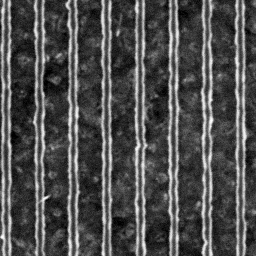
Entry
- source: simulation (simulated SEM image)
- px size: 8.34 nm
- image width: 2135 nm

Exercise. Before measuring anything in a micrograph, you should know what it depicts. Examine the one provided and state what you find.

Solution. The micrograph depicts parallel lines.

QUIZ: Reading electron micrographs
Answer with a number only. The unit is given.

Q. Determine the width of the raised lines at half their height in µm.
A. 0.0636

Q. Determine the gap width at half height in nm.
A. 213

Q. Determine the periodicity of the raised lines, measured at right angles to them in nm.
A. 279